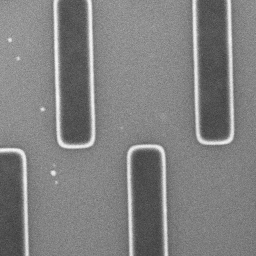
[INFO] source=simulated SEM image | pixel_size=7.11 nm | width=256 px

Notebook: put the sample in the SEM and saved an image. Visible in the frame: groups of lines, slits or small figures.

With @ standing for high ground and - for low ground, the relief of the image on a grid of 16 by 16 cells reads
---@@@------@@--
---@@@------@@--
---@@@------@@--
----@@------@@--
----@@------@@--
----@@------@@--
----@@------@@--
----@@------@@--
----@@------@@--
@-------@@------
@@------@@------
@@------@@------
@@------@@------
@@------@@------
@@------@@------
@@------@@------